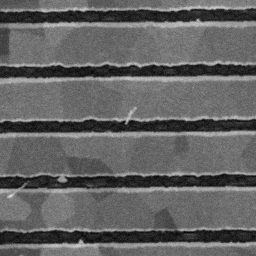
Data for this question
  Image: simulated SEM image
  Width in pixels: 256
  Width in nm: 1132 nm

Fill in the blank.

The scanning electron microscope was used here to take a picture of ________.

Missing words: lines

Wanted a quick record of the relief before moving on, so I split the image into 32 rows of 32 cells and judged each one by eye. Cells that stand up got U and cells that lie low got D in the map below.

UUUUUUUUUUUUUUUUUUUUUUUUUUUUUUUU
DDDDDDDDDDDDDDDDDDDDDDDDDDDDDDDD
DDDDDDDDDDDDDDDDDDDDDDDDDDDDDDDD
UUUUUUUUUUUUUUUUUUUUUUUUUUUUUUUU
UUUUUUUUUUUUUUUUUUUUUUUUUUUUUUUU
UUUUUUUUUUUUUUUUUUUUUUUUUUUUUUUU
UUUUUUUUUUUUUUUUUUUUUUUUUUUUUUUU
UUUUUUUUUUUUUUUUUUUUUUUUUUUUUUUU
DDDDDDDDDDDDDDDDDDDDDDDDDDDDDDDD
DDDDDDDDDDDDDDDDDDDDDDDDDDDDDDDD
UUUUUUUUUUUUUUUUUUUUUUUUUUUUUUUU
UUUUUUUUUUUUUUUUUUUUUUUUUUUUUUUU
UUUUUUUUUUUUUUUUUUUUUUUUUUUUUUUU
UUUUUUUUUUUUUUUUUUUUUUUUUUUUUUUU
UUUUUUUUUUUUUUUUUUUUUUUUUUUUUUUU
DDDDDDDDDDDDDDDDDDDDDDDDDDDDDDDD
DDDDDDDDDDDDDDDDDDDDDDDDDDDDDDDD
UUUUUUUUUUUUUUUUUUUUUUUUUUUUUUUU
UUUUUUUUUUUUUUUUUUUUUUUUUUUUUUUU
UUUUUUUUUUUUUUUUUUUUUUUUUUUUUUUU
UUUUUUUUUUUUUUUUUUUUUUUUUUUUUUUU
UUUUUUUUUUUUUUUUUUUUUUUUUUUUUUUU
DDDDDDDDDDDDDDDDDDDDDDDDDDDDDDDD
DDDDDDDDDDDDDDDDDDDDDDDDDDDDDDDD
UUUUUUUUUUUUUUUUUUUUUUUUUUUUUUUU
UUUUUUUUUUUUUUUUUUUUUUUUUUUUUUUU
UUUUUUUUUUUUUUUUUUUUUUUUUUUUUUUU
UUUUUUUUUUUUUUUUUUUUUUUUUUUUUUUU
UUUUUUUUUUUUUUUUUUUUUUUUUUUUUUUU
DDDDDDDDDDDDDDDDDDDDDDDDDDDDDDDD
DDDDDDDDDDDDDDDDDDDDDDDDDDDDDDDU
UUUUUUUUUUUUUUUUUUUUUUUUUUUUUUUU